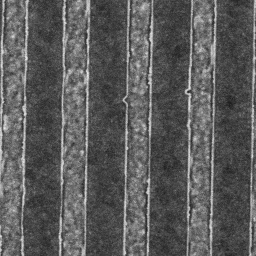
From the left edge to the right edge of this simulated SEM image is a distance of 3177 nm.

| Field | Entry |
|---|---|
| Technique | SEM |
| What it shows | one or a few lines or trenches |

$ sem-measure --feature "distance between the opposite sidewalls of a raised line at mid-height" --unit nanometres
502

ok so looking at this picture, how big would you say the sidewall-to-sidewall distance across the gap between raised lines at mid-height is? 279 nm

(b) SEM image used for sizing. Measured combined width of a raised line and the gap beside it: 783 nm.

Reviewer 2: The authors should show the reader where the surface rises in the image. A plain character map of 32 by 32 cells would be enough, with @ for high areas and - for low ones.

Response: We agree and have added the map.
---@@@@@---@@@@@---@@@@@---@@@@@
---@@@@@---@@@@@---@@@@@---@@@@@
---@@@@@---@@@@@---@@@@@@--@@@@@
---@@@@@---@@@@@---@@@@@---@@@@@
---@@@@@---@@@@@---@@@@@---@@@@@
---@@@@@---@@@@@---@@@@@---@@@@@
---@@@@@---@@@@@--@@@@@@---@@@@@
---@@@@@---@@@@@---@@@@@---@@@@@
---@@@@@---@@@@@---@@@@@---@@@@@
---@@@@@---@@@@@---@@@@@---@@@@@
---@@@@@---@@@@@---@@@@@---@@@@@
---@@@@@---@@@@@---@@@@@---@@@@@
---@@@@@---@@@@@---@@@@@---@@@@@
---@@@@@---@@@@@---@@@@@---@@@@@
---@@@@@---@@@@@---@@@@@-@@@@@@@
@--@@@@@---@@@@@-@-@@@@@---@@@@@
---@@@@@---@@@@@---@@@@@---@@@@@
---@@@@@---@@@@@---@@@@@---@@@@@
---@@@@@---@@@@@---@@@@@---@@@@@
---@@@@@---@@@@@---@@@@@---@@@@@
---@@@@@---@@@@@---@@@@@--@@@@@-
---@@@@@---@@@@@---@@@@@--@@@@@-
---@@@@@---@@@@@---@@@@@--@@@@@-
---@@@@@---@@@@@--@@@@@@--@@@@@-
---@@@@@---@@@@@--@@@@@@--@@@@@-
---@@@@@---@@@@@---@@@@@--@@@@@-
---@@@@@---@@@@@--@@@@@@--@@@@@-
---@@@@@---@@@@@--@@@@@@--@@@@@-
---@@@@@---@@@@@--@@@@@@--@@@@@-
---@@@@@---@@@@@--@@@@@@--@@@@@@
---@@@@@---@@@@@--@@@@@---@@@@@-
---@@@@@---@@@@@--@@@@@---@@@@@-